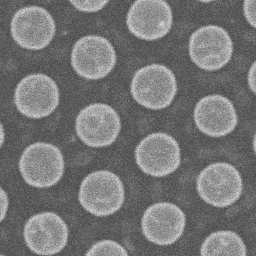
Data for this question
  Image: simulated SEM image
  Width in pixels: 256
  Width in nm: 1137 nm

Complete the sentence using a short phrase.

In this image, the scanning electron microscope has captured a regular array of raised bodies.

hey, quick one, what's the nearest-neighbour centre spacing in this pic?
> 300 nanometers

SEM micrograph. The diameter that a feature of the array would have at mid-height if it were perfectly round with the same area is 0.192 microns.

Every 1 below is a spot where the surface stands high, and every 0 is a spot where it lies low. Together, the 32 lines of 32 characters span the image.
00000000011110000111100000000001
00111100000000001111100000000001
00111110000000001111100000000001
01111110000000001111100001100000
00111110000000000111000011111000
00111100001111000000000011111000
00000000011111000000000011111000
00000000011111000000000011111000
00000000011111000011100001100001
00001100001110000111110000000001
00111110000000000111110000000001
00111110000000001111110000000000
00111110000000000111100001110000
00111110000111000001000011111000
00001000001111100000000011111000
00000000001111100000000001111000
00000000001111100000000000111000
00000000001111000011110000000000
00011110000000000111110000000000
00011111000000000111110000000000
00111111000000000111110000010000
00011111000010000011100001111100
00011110001111100000000001111100
00000000001111100000000001111100
10000000001111100000000001111100
10000000001111100000100000011000
10000000000111000011111000000000
00001111000000000011111000000000
00011111000000000011111000000000
00011111000000000011110000111100
00011111000011100000100001111100
00001110000111110000000001111110